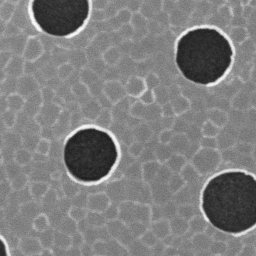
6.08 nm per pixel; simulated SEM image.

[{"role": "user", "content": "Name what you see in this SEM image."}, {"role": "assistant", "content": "holes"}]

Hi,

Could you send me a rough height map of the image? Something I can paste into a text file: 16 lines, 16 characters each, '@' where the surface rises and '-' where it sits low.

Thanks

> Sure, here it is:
@@----@@@@@@@@@@
@@---@@@@@@@@@@@
@@@@@@@@@@@---@@
@@@@@@@@@@@---@@
@@@@@@@@@@@---@@
@@@@@@@@@@@@@@@@
@@@@@@@@@@@@@@@@
@@@@@@@@@@@@@@@@
@@@@@--@@@@@@@@@
@@@@---@@@@@@@@@
@@@@---@@@@@@@@@
@@@@@@@@@@@@@---
@@@@@@@@@@@@@---
@@@@@@@@@@@@@---
@@@@@@@@@@@@@@-@
@@@@@@@@@@@@@@@@